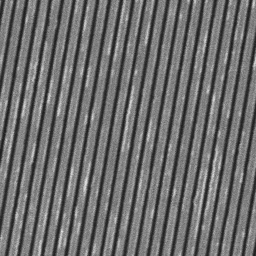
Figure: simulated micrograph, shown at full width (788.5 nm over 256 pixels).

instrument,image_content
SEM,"parallel lines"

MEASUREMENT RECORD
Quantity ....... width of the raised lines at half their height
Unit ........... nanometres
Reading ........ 23.9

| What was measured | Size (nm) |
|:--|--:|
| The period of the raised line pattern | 35.8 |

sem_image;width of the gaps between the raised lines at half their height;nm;12.9